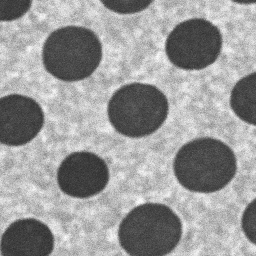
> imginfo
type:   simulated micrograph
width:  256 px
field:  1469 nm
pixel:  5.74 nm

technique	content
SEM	holes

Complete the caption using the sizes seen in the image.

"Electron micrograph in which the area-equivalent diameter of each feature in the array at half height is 337 nm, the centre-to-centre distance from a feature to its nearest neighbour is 496 nanometres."